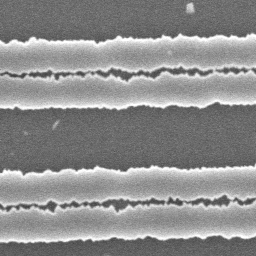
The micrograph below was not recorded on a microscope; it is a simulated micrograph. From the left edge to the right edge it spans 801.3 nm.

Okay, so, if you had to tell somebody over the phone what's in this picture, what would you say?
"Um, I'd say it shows lines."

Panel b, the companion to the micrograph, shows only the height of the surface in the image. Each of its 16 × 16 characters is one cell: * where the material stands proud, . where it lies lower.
................
................
..*....*********
****************
****************
****************
*************...
................
................
................
.........*....**
****************
****************
****************
****************
................